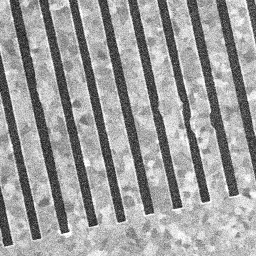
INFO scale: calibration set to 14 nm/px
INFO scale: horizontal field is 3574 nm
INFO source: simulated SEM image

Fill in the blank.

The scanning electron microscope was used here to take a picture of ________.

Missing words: parallel lines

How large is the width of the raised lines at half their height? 269 nanometres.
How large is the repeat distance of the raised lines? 403 nm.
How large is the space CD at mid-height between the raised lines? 142 nanometers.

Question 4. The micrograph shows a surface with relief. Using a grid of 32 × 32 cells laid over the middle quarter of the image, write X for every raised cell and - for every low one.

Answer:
XXXXX--XXXXX---XXXX---XXXXX--XXX
XXXXX--XXXXX---XXXX---XXXXX--XXX
XXXXX---XXXX---XXXXX--XXXXX---XX
XXXXX---XXXXX--XXXXX---XXXX---XX
-XXXXX--XXXXX---XXXX---XXXXX--XX
-XXXXX--XXXXX---XXXX---XXXXX--XX
-XXXXX--XXXXX---XXXXX--XXXXX---X
-XXXXX---XXXX---XXXXX--XXXXX---X
--XXXX---XXXXX--XXXXX---XXXXX--X
--XXXXX--XXXXX---XXXX---XXXXX--X
--XXXXX--XXXXX---XXXX---XXXXXX-X
--XXXXX---XXXX---XXXXX--XXXXX---
--XXXXX---XXXXX--XXXXX--XXXXX---
---XXXXX--XXXXX--XXXXX---XXXXX--
---XXXXX--XXXXX---XXXX---XXXXX--
---XXXXX--XXXXX---XXXXX--XXXXX--
X--XXXXX---XXXX---XXXXX--XXXXX--
X---XXXX---XXXXX--XXXXX---XXXXX-
X---XXXXX--XXXXX---XXXX---XXXXX-
X---XXXXX--XXXXX---XXXX---XXXXX-
XX--XXXXX--XXXXX---XXXXX--XXXXX-
XX--XXXXX---XXXXX--XXXXX---XXXX-
XX---XXXX---XXXXX--XXXXX---XXXXX
XX---XXXXX--XXXXX---XXXX---XXXXX
XX---XXXXX--XXXXX---XXXXX--XXXXX
XXX--XXXXX---XXXX---XXXXX--XXXXX
XXX---XXXX---XXXXX--XXXXX---XXXX
XXX---XXXXX--XXXXX---XXXX---XXXX
XXX---XXXXX--XXXXX---XXXX---XXXX
XXX---XXXXX--XXXXX---XXXXX--XXXX
XXXX--XXXXX---XXXXX--XXXXX---XXX
XXXX---XXXX---XXXXX--XXXXX---XXX